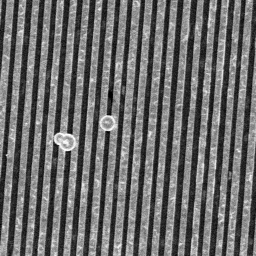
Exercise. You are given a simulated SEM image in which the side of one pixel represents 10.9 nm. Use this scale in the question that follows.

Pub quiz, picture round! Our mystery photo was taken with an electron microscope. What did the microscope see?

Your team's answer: parallel lines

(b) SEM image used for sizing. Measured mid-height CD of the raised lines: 70.9 nm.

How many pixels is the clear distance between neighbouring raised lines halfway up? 5.98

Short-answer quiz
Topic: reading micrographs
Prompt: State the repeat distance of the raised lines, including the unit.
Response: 0.138 micrometres